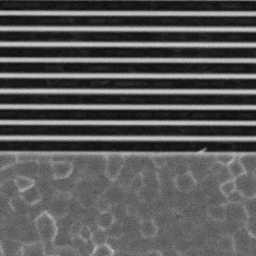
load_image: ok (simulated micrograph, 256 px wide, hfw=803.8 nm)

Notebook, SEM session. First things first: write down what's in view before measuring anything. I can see parallel lines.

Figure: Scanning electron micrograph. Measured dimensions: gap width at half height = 36.1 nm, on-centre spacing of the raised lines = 49.1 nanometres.